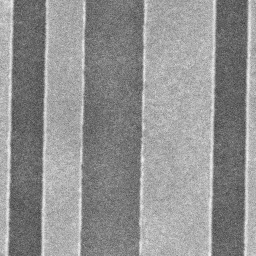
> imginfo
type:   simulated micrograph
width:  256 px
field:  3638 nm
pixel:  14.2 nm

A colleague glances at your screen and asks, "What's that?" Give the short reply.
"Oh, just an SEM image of lines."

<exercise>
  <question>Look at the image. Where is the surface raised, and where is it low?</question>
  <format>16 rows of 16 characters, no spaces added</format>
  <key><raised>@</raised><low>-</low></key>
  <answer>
@--@@----@@@@---
@--@@----@@@@---
@--@@----@@@@---
@--@@----@@@@---
@--@@----@@@@---
@--@@----@@@@---
@--@@----@@@@---
@--@@----@@@@---
@--@@----@@@@--@
@--@@----@@@@--@
@--@@----@@@@--@
@--@@----@@@@--@
@--@@----@@@@--@
@--@@----@@@@--@
---@@----@@@@--@
---@@----@@@@--@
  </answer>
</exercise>